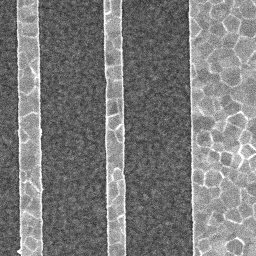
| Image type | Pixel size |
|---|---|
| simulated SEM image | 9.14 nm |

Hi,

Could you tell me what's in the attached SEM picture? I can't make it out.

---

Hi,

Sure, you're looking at one or a few lines or trenches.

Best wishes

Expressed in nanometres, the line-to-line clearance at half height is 598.